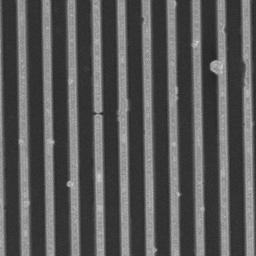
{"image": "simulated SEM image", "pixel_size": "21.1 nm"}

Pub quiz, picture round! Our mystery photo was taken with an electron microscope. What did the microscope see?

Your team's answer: parallel lines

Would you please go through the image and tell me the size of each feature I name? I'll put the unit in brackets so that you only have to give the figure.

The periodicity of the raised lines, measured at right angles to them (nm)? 527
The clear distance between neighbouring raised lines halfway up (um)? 0.353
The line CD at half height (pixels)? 8.37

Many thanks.